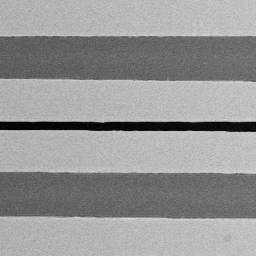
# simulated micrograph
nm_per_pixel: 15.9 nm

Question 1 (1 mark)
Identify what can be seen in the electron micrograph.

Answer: lines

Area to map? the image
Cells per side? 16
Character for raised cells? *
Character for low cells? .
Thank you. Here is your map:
****************
****************
................
................
................
****************
****************
****************
****************
****************
****************
................
................
................
****************
****************